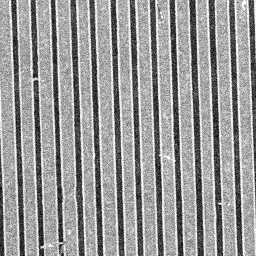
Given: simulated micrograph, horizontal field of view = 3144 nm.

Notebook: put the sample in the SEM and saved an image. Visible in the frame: parallel lines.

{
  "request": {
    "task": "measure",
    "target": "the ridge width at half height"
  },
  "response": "158 nm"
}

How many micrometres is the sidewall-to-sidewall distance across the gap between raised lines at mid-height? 0.0844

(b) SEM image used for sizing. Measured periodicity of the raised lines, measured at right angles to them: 243 nm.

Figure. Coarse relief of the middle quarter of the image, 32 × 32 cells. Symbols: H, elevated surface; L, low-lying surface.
HHLLHHHLLHHHLLHHHLLHHHLLHHHLHHHL
HHLLHHHLLHHHLLHHHLLHHHLLHHHLLHHH
HHLLHHHLLHHHLLHHHLLHHHLLHHHLLHHH
HHLLHHHLLHHHLLHHHLLHHHLLHHHLLHHH
HHLLHHHLLHHHLLHHHLLHHHLLHHHLLHHH
HHLLHHHLLHHHLLHHHLLHHHLLHHHLLHHH
HHLLHHHLLHHHLLHHHLLHHHLLHHHLLHHH
HHLLHHHLLHHHLLHHHLLHHHLLHHHLLHHH
HHLLHHHLLHHHLLHHHLLHHHLLHHHLLHHH
HHLLHHHLLHHHLLHHHLLHHHLLHHHLLHHH
HHLLHHHLLHHHLLHHHLLHHHLLHHHLLHHH
HHLLHHHLLHHHLLHHHLLHHHLLHHHLLHHH
HHLLHHHLLHHHLLHHHLLHHHLLHHHLLHHH
HHLLHHHLLHHHLLHHHLLHHHLLHHHLLHHH
HHLLHHHLLHHHLLHHHLLHHHLLHHHLLHHH
HHLLHHHLLHHHLLHHHLLHHHLLHHHLLHHH
HHLLHHHLLHHHLLHHHLLHHHLLHHHLLHHH
HHLLHHHLLHHHLLLHHLLHHHLLHHHLLHHH
HHHLHHHLLHHHLLLHHLLHHHLLHHHLLHHH
HHHLLHHLLHHHLLLHHLLHHHLLHHHLLHHH
HHHLLHHLLHHHLLLHHLLHHHLLHHHLLHHH
HHHLLHHLLHHHLLLHHLLHHHLLHHHLLHHH
HHHLLHHLLHHHHLLHHLLHHHLLHHHLLHHH
HHHLLHHLLHHHHLLHHLLHHHLLHHHLLHHH
HHHLLHHLLHHHHLLHHLLHHHLLHHHHLHHH
HHHLLHHLLHHHHLLHHLLHHHLLLHHLLHHH
HHHLLHHHLHHHHLLHHLLLHHHLLHHLLHHH
HHHLLHHHLHHHHLLHHLLLHHHLLHHLLHHH
HHHLLHHHLLHHHLLHHLLLHHHLLHHLLHHH
HHHLLHHHLLHHHLLHHLLLHHHLLHHHLHHH
HHHLLHHHLLHHHLLHHHLLHHHLLHHHLLHH
HHHLLHHHLLHHHLLHHHLLHHHLLHHHLLHH